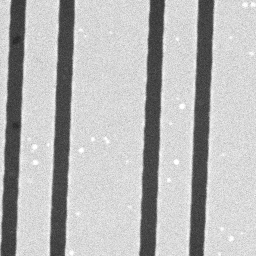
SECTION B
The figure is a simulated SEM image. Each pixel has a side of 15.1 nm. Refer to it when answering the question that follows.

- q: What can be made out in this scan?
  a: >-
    lines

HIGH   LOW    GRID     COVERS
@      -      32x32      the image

@--@@@@--@@@@@@@@@@--@@@@--@@@@@
@--@@@@--@@@@@@@@@@--@@@@--@@@@@
@--@@@@--@@@@@@@@@@--@@@@--@@@@@
@--@@@@--@@@@@@@@@@--@@@@--@@@@@
@--@@@@--@@@@@@@@@@-@@@@@--@@@@@
@--@@@@--@@@@@@@@@--@@@@@--@@@@@
@--@@@@--@@@@@@@@@--@@@@@--@@@@@
@--@@@@--@@@@@@@@@--@@@@---@@@@@
@--@@@@--@@@@@@@@@--@@@@---@@@@@
@--@@@@--@@@@@@@@@--@@@@---@@@@@
@--@@@@--@@@@@@@@@--@@@@--@@@@@@
@--@@@@--@@@@@@@@@--@@@@--@@@@@@
@--@@@@--@@@@@@@@@--@@@@--@@@@@@
@--@@@@--@@@@@@@@@--@@@@--@@@@@@
@--@@@@--@@@@@@@@@--@@@@--@@@@@@
@--@@@@--@@@@@@@@@--@@@@--@@@@@@
@--@@@@--@@@@@@@@@--@@@@--@@@@@@
@--@@@@--@@@@@@@@@--@@@@--@@@@@@
@--@@@@--@@@@@@@@@--@@@@--@@@@@@
---@@@@--@@@@@@@@@--@@@@--@@@@@@
---@@@@--@@@@@@@@@--@@@@--@@@@@@
--@@@@@--@@@@@@@@@--@@@@--@@@@@@
--@@@@@--@@@@@@@@@--@@@@--@@@@@@
--@@@@@-@@@@@@@@@@--@@@@--@@@@@@
--@@@@--@@@@@@@@@@--@@@@--@@@@@@
--@@@@--@@@@@@@@@@--@@@@--@@@@@@
--@@@@--@@@@@@@@@@--@@@@--@@@@@@
--@@@@--@@@@@@@@@@--@@@@--@@@@@@
--@@@@--@@@@@@@@@@--@@@@--@@@@@@
--@@@@--@@@@@@@@@---@@@@--@@@@@@
--@@@@--@@@@@@@@@--@@@@@--@@@@@@
--@@@@--@@@@@@@@@--@@@@@--@@@@@@